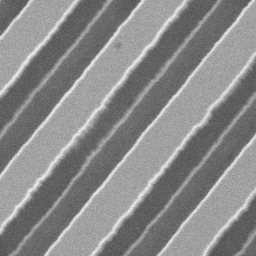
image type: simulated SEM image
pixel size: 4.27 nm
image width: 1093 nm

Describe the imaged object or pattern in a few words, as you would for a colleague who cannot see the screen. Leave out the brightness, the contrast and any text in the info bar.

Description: lines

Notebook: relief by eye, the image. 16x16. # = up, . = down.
.###....###....#
.###....##.....#
###....###....##
##....###....###
#....###....###.
....###....###..
....##....###...
...###....###...
..###....###....
.###....###....#
###....###....##
##....###....###
##....###....###
#....###....###.
....###....###..
...###....###...